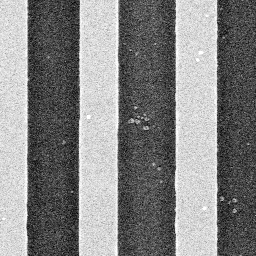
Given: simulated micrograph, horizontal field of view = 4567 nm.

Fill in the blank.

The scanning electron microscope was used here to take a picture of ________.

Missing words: lines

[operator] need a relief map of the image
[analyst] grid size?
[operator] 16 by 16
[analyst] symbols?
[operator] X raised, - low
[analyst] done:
XX---XX----XXX--
XX---XX----XXX--
XX---XX----XXX--
XX---XX----XXX--
XX---XX----XXX--
XX---XX----XXX--
XX---XX----XXX--
XX---XX----XXX--
XX---XX----XXX--
XX---XX----XXX--
XX---XX----XXX--
XX---XX----XXX--
XX---XX----XXX--
XX---XX----XXX--
XX---XX----XXX--
XX---XX----XXX--